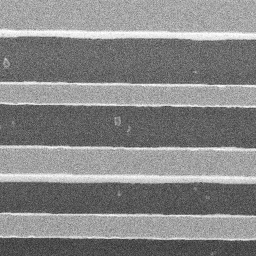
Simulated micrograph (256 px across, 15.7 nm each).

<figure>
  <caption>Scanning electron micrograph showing lines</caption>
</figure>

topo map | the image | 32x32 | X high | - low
XXXXXXXXXXXXXXXXXXXXXXXXXXXXXXXX
XXXXXXXXXXXXXXXXXXXXXXXXXXXXXXXX
XXXXXXXXXXXXXXXXXXXXXXXXXXXXXXXX
XXXXXXXXXXXXXXXXXXXXXXXXXXXXXXXX
--------------------------------
--------------------------------
--------------------------------
--------------------------------
--------------------------------
--------------------------------
XXXXXXXXXX----------------------
XXXXXXXXXXXXXXXXXXXXXXXXXXXXXXXX
XXXXXXXXXXXXXXXXXXXXXXXXXXXXXXXX
--------------------------------
--------------------------------
--------------------------------
--------------------------------
--------------------------------
XXXXXXXXX-----------------------
XXXXXXXXXXXXXXXXXXXXXXXXXXXXXXXX
XXXXXXXXXXXXXXXXXXXXXXXXXXXXXXXX
XXXXXXXXXXXXXXXXXXXXXXXXXXXXXXXX
--------------------------------
--------------------------------
--------------------------------
--------------------------------
--------------------------------
XXXXXXXXXXXXXXXXXXXXXXXXXXXXXXXX
XXXXXXXXXXXXXXXXXXXXXXXXXXXXXXXX
XXXXXXXXXXXXXXXXXXXXXXXXXXXXXXXX
--------------------------------
--------------------------------